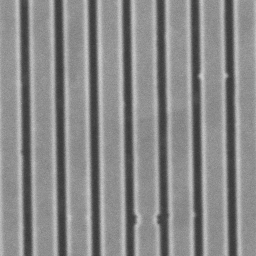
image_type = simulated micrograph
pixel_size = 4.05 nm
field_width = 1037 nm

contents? parallel lines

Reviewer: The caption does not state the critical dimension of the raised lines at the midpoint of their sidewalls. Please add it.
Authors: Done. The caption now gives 0.0927 micrometres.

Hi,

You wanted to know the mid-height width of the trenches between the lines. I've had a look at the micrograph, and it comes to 48.1 nanometers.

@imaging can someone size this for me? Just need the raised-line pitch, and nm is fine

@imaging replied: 138